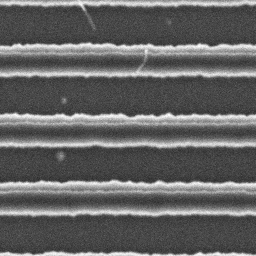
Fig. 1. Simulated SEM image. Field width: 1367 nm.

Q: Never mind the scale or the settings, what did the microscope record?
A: lines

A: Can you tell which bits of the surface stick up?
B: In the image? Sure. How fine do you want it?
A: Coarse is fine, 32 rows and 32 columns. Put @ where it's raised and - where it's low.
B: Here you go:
-----@----@--------------@------
--------------------------------
--------------------------------
--------------------------------
--------------------------------
----------@---------------------
@@@@@@@@@@@@@@@@@@@@@@@@@@@@@@@@
@@@@@@@@@@@@@@@@@@@@@@@@@@@@@@@@
@@@@@@@@@@@@@@@@@@@@@@@@@@@@@@@@
--------------------------------
--------------------------------
--------------------------------
--------------------------------
--------------------------------
@@@@@-@@-@@-@@@@-@@-@@@@@@-@@@@@
@@@@@@@@@@@@@@@@@@@@@@@@@@@@@@@@
@@@@@@@@@@@@@@@@@@@@@@@@@@@@@@@@
@@@@@@@@@@@@@@@@@@@@@@@@@@@@@@@@
--------------------------------
--------------------------------
--------------------------------
--------------------------------
--------------------------------
@@@@@@@@@@@@@@@@@@@@@@@@@@@@@@@@
@@@@@@@@@@@@@@@@@@@@@@@@@@@@@@@@
@@@@@@@@@@@@@@@@@@@@@@@@@@@@@@@@
@@@@@@@@@@-@@@@@@@@@@@@@@@@@@@@@
--------------------------------
--------------------------------
--------------------------------
--------------------------------
--------------------------------